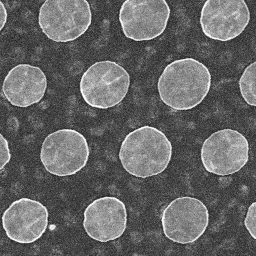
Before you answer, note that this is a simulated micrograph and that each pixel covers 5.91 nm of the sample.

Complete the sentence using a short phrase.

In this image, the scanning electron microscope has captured a regular array of raised bodies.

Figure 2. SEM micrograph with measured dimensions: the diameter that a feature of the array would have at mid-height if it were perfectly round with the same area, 46.3 px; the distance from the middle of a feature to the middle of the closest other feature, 464 nanometres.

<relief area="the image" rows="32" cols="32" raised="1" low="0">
00000111111000011111100000111110
10000111111000011111100001111110
10000111111000011111100001111110
00000111111000011111100001111110
00000011110000001111000000111100
00000000000000000000000000000000
00000000000000000000000000000000
00000000000000000000000100000000
00111000000111100000011111000001
01111100001111110000111111000011
11111100001111110000111111000011
01111000001111110000111111000011
01111000000111100000111110000001
00000000000000000000001100000000
00000000000000000000000000000000
00000000000000000000000000000000
00000001110000000111000000011100
10000011111000001111100000111110
10000111111000011111100001111110
10000111111000011111100001111110
10000111111000011111100001111110
00000011100000001111000000111000
00000000000000000000000000000000
00000000000000000000000000000000
00000000000000000000000000000000
00111000000111100000011110000000
01111100000111110000011111000000
11111100000111110000111111000001
01111100000111110000111111000001
01111000000111100000011110000000
00000000000000000000000000000000
00000000000000000000000000000000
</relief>